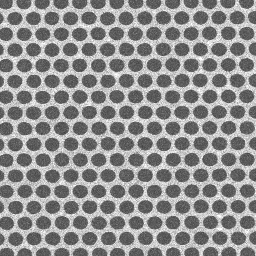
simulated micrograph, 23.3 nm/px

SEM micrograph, a regular array of holes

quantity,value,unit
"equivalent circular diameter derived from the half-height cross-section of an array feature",339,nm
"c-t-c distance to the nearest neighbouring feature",0.418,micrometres